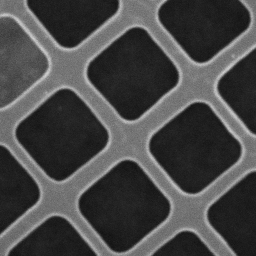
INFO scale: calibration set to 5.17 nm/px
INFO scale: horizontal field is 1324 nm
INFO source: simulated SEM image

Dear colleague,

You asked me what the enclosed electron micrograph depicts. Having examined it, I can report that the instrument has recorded holes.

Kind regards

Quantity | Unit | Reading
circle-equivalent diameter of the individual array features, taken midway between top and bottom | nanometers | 431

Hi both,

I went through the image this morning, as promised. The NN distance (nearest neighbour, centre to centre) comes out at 478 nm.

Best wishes